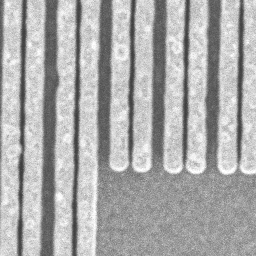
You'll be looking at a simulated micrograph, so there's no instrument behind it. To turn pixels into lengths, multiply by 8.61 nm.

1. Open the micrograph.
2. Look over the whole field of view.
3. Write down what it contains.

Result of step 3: parallel lines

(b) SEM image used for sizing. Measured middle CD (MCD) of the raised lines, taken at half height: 0.158 microns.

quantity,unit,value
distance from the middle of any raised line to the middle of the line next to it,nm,231